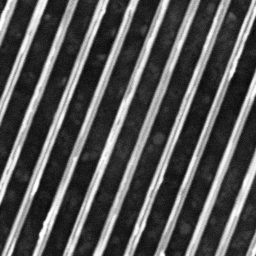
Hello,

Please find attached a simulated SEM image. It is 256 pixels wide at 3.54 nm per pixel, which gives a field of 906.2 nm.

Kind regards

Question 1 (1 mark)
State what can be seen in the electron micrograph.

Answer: parallel lines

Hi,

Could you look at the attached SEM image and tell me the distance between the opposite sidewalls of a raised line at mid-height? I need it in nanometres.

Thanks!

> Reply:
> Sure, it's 27.3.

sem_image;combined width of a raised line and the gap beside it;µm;0.101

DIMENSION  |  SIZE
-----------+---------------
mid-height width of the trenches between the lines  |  75.1 nanometres